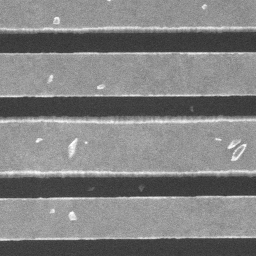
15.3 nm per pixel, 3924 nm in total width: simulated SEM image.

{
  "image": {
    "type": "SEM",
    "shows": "lines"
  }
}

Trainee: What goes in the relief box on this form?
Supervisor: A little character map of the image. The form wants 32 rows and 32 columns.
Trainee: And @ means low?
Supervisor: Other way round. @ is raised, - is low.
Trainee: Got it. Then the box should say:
@@@@@@@@@@@@@@@@@@@@@@@@@@@@@@@@
@@@@@@@@@@@@@@@@@@@@@@@@@@@@@@@@
@@@@@@@@@@@@@@@@@@@@@@@@@@@@@@@@
@@@@@@@@@@@@@@@@@@@@@@@@@@@@@@@@
--------------------------------
--------------------------------
--------------------------------
@@@@@@@@@@@@@@@@@@@@@@@@@@@@@@@@
@@@@@@@@@@@@@@@@@@@@@@@@@@@@@@@@
@@@@@@@@@@@@@@@@@@@@@@@@@@@@@@@@
@@@@@@@@@@@@@@@@@@@@@@@@@@@@@@@@
@@@@@@@@@@@@@@@@@@@@@@@@@@@@@@@@
--------------------------------
--------------------------------
--------------------------------
@@@@@@@@@@@@@@@@@@@@@@@@@@@@@@@@
@@@@@@@@@@@@@@@@@@@@@@@@@@@@@@@@
@@@@@@@@@@@@@@@@@@@@@@@@@@@@@@@@
@@@@@@@@@@@@@@@@@@@@@@@@@@@@@@@@
@@@@@@@@@@@@@@@@@@@@@@@@@@@@@@@@
@@@@@@@@@@@@@@@@@@@@@@@@@@@@@@@@
@@@@@@@@@@@@@@@@@@@@@@@@@@@@@@@@
--------------------------------
--------------------------------
--------------------------------
@@@@@@@@@@@@@@@@@@@@@@@@@@@@@@@@
@@@@@@@@@@@@@@@@@@@@@@@@@@@@@@@@
@@@@@@@@@@@@@@@@@@@@@@@@@@@@@@@@
@@@@@@@@@@@@@@@@@@@@@@@@@@@@@@@@
@@@@@@@@@@@@@@@@@@@@@@@@@@@@@@@@
--------------------------------
--------------------------------